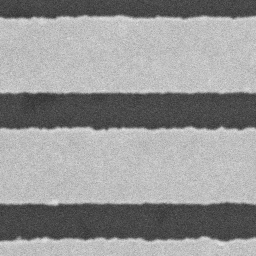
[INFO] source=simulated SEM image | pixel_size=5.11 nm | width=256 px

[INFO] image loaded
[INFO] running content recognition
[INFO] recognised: lines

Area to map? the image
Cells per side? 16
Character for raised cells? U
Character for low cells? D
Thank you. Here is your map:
DDDDDDDDDDDDDDDD
UUUUUUUUUUUUUUUU
UUUUUUUUUUUUUUUU
UUUUUUUUUUUUUUUU
UUUUUUUUUUUUUUUU
UUUUUUUUUUUUUUUU
DDDDDDDDDDDDDDDD
DDDDDDDDDDDDDDDD
UUUUUUUUUUUUUUUU
UUUUUUUUUUUUUUUU
UUUUUUUUUUUUUUUU
UUUUUUUUUUUUUUUU
UUUUUUUUUUUUUUUU
DDDDDDDDDDDDDDDD
DDDDDDDDDDDDDDDD
UUUUUUUUUUUUUUUU